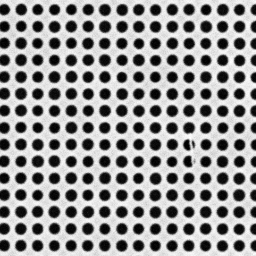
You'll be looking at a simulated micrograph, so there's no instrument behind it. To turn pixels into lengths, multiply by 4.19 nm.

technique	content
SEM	a regular array of holes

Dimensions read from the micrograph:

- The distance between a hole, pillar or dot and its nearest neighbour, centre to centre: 68.8 nm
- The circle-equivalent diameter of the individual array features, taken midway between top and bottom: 48.1 nm